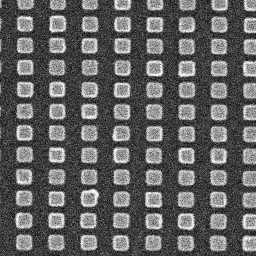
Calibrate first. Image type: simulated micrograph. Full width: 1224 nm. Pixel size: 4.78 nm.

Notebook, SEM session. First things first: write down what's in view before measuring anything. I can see a regular array of raised bodies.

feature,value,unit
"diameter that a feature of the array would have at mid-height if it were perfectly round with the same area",77.1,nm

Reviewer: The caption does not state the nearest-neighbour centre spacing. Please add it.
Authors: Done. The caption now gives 0.103 µm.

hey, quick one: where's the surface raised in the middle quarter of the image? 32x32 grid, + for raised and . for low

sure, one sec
.....+++.....+++.....++++....+++
.....+++.....+++.....++++....+++
.......+.....+++.....+++.....+++
................................
................................
.....+++.....+++.....+++.....+++
.....+++.....+++.....+++.....+++
.....+++.....+++.....+++.....+++
................................
................................
.....+++.....+++.....+++.....+++
.....+++.....+++.....+++.....+++
.....+++.....+++.....+++.....+++
.....+++.....+++.....+++.....+++
................................
................................
.....+++.....+++.....+++.....+++
.....+++....++++.....+++.....+++
.....+++....++++.....+++.....+++
................................
................................
.....+++.....+++.....+++.....+++
.....+++.....+++.....+++.....+++
....++++.....+++.....+++.....+++
.....................+++.....+++
................................
.....+..........................
....++++.....+++.....+++.....+++
....++++.....+++.....+++.....+++
.....+++.....+++.....+++.....+++
................................
.......+........................